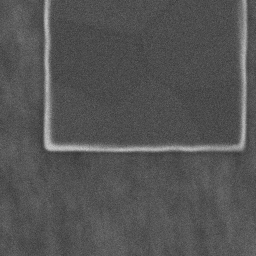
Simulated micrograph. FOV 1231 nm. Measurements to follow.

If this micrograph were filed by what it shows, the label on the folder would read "wiring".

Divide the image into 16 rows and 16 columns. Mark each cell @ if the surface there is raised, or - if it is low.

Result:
---@@@@@@@@@@@@-
---@@@@@@@@@@@@-
---@@@@@@@@@@@@-
---@@@@@@@@@@@@-
---@@@@@@@@@@@@-
---@@@@@@@@@@@@-
---@@@@@@@@@@@@-
---@@@@@@@@@@@@-
---@@@@@@@@@@@@-
----------------
----------------
----------------
----------------
----------------
----------------
----------------